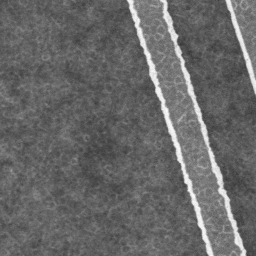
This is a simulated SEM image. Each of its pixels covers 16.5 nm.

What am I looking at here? one or a few lines or trenches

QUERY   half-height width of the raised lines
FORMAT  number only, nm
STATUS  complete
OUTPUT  516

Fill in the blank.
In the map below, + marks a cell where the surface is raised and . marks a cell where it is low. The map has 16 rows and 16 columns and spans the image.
........++....++
.........++....+
.........++....+
.........++....+
..........++....
..........++....
..........++....
..........+++...
...........++...
...........++...
...........++...
............++..
............++..
............++..
.............++.
.............++.